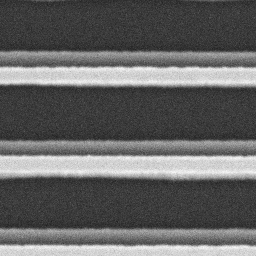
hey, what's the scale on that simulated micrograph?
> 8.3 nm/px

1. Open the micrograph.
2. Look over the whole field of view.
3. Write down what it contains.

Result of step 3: lines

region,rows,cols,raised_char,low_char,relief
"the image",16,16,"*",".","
................
................
................
****************
****************
................
................
................
................
****************
****************
................
................
................
****************
****************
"